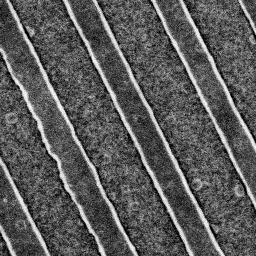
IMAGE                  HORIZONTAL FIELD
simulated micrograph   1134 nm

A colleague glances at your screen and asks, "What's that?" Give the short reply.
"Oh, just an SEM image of one or a few lines or trenches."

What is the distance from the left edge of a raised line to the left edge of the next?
0.346 um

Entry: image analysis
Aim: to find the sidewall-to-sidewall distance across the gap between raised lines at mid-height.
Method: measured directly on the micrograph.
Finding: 225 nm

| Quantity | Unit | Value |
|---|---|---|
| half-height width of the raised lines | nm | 118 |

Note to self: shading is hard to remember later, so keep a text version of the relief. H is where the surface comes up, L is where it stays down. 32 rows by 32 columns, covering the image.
HLLLLLLLHHHHLLLLLLLHHHHLLLLLLLHH
HHLLLLLLLHHHHLLLLLLLHHHLLLLLLLLH
HHLLLLLLLHHHHLLLLLLLHHHHLLLLLLLH
HHHLLLLLLLHHHLLLLLLLLHHHLLLLLLLL
HHHLLLLLLLHHHHLLLLLLLHHHHLLLLLLL
HHHHLLLLLLLHHHLLLLLLLLHHHLLLLLLL
HHHHLLLLLLLHHHHLLLLLLLHHHHLLLLLL
LHHHHLLLLLLLHHHLLLLLLLLHHHLLLLLL
LHHHHLLLLLLLHHHHLLLLLLLHHHHLLLLL
LLHHHHLLLLLLLHHHLLLLLLLLHHHLLLLL
LLHHHHLLLLLLLHHHHLLLLLLLHHHHLLLL
LLLHHHHLLLLLLLHHHLLLLLLLLHHHLLLL
LLLHHHHLLLLLLLHHHHLLLLLLLHHHHLLL
LLLLHHHHLLLLLLLHHHHLLLLLLLHHHLLL
LLLLHHHHLLLLLLLHHHHLLLLLLLHHHHLL
LLLLLHHHHLLLLLLLHHHLLLLLLLLHHHLL
LLLLLHHHHLLLLLLLHHHHLLLLLLLHHHHL
LLLLLLHHHHLLLLLLLHHHHLLLLLLLHHHH
LLLLLLHHHHLLLLLLLHHHHLLLLLLLHHHH
LLLLLLLHHHHLLLLLLLHHHLLLLLLLLHHH
LLLLLLLHHHHLLLLLLLHHHHLLLLLLLHHH
HLLLLLLLHHHHLLLLLLLHHHLLLLLLLLHH
HLLLLLLLHHHHLLLLLLLHHHHLLLLLLLHH
HHLLLLLLHHHHHLLLLLLLHHHLLLLLLLLH
HHLLLLLLLHHHHLLLLLLLHHHHLLLLLLLH
HHHLLLLLLLHHHHLLLLLLLHHHHLLLLLLL
HHHLLLLLLLHHHHLLLLLLLHHHHLLLLLLL
HHHHLLLLLLLHHHHLLLLLLLHHHLLLLLLL
HHHHLLLLLLLHHHHLLLLLLLHHHHLLLLLL
HHHHHLLLLLLLHHHHLLLLLLLHHHLLLLLL
LHHHHLLLLLLLHHHHLLLLLLLHHHHLLLLL
LHHHHHLLLLLLLHHHHLLLLLLLHHHHLLLL